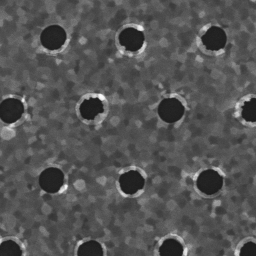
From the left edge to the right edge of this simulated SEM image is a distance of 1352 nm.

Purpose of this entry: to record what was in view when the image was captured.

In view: a regular array of holes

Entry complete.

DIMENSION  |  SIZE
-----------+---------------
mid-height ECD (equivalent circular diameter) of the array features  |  134 nanometres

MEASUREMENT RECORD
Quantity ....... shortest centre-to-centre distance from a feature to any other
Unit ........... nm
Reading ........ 417